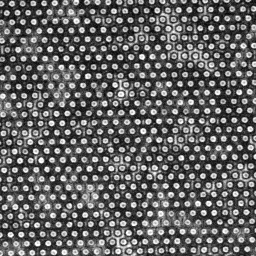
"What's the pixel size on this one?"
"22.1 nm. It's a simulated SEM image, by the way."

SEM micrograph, a regular array of raised bodies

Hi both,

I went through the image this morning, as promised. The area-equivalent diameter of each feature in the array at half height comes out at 99.7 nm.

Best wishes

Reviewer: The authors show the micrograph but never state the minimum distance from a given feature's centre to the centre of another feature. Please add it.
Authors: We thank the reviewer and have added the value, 230 nm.